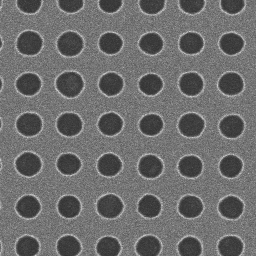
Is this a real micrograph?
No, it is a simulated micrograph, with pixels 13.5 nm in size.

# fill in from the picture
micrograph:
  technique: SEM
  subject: a regular array of holes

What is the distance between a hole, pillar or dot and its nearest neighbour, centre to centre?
541 nanometres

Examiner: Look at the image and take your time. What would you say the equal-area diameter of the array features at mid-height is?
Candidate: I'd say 310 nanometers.